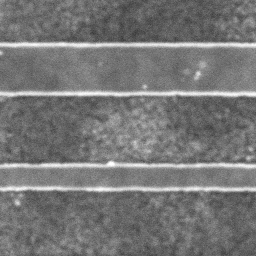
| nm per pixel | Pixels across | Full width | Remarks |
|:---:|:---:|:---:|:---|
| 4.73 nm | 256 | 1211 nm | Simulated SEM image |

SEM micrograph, lines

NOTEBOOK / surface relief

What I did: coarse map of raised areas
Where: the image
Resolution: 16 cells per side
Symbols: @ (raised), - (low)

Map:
----------------
----------------
----------------
@@@@@@@@@@@@@@@@
@@@@@@@@@@@@@@@@
@@@@@@@@@@@@@@@@
----------------
----------------
----------------
----------------
@@@@@@@@@@@@@@@@
@@@@@@@@@@@@@@@@
----------------
----------------
----------------
----------------